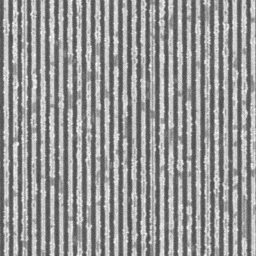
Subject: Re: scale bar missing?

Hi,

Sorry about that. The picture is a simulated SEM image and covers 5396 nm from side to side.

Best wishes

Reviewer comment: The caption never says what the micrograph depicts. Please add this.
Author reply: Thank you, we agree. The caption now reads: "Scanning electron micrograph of parallel lines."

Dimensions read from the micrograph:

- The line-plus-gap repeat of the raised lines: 193 nm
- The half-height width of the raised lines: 0.0843 microns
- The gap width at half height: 6 px